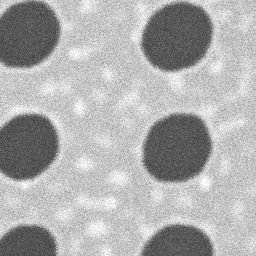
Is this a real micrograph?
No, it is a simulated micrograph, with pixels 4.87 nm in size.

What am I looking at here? holes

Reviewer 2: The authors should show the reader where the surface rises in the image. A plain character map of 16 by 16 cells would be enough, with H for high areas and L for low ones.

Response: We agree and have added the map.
LLLHHHHHHHLLLHHH
LLLLHHHHHLLLLHHH
LLLLHHHHHLLLLHHH
LLLHHHHHHLLLLHHH
HHHHHHHHHHLHHHHH
HHHHHHHHHHHHHHHH
HHHHHHHHHHHHHHHH
HLLHHHHHHHLLLHHH
LLLLHHHHHLLLLHHH
LLLLHHHHHLLLLHHH
LLLHHHHHHLLLLHHH
HHHHHHHHHHHHHHHH
HHHHHHHHHHHHHHHH
HHHHHHHHHHHHHHHH
LLLHHHHHHHLLLHHH
LLLLHHHHHLLLLHHH